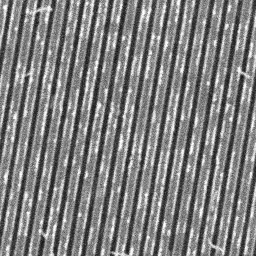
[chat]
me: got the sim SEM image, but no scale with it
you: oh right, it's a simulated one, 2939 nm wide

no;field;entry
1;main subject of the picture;parallel lines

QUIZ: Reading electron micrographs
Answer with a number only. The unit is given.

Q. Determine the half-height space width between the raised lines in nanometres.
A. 65.1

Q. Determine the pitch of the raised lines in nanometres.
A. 162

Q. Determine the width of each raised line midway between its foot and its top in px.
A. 8.5